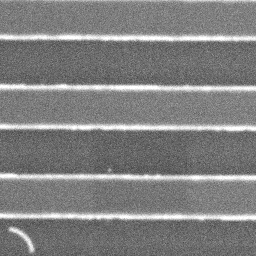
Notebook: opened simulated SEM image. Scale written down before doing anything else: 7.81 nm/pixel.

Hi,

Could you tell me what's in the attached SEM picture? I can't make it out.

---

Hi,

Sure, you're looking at lines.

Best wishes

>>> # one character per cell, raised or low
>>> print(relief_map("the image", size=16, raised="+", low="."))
++++++++++++++++
++++++++++++++++
................
................
................
++++++++++++++++
++++++++++++++++
++++++++++++++++
................
................
................
++++++++++++++++
++++++++++++++++
++++++++++++++++
................
................